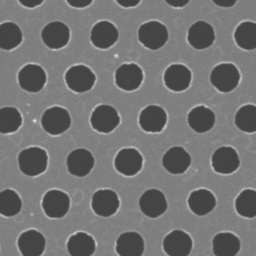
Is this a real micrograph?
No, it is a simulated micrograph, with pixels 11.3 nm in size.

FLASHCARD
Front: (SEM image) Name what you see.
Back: a regular array of holes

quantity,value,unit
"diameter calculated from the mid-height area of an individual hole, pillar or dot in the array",317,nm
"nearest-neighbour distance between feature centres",0.536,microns